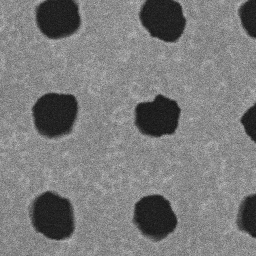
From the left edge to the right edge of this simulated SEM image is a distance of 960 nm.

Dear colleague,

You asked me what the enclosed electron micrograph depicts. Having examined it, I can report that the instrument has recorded holes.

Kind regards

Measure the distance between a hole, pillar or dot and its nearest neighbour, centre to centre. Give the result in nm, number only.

380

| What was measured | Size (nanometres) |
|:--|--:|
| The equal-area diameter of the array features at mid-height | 165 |